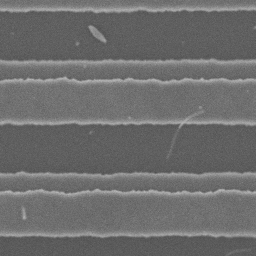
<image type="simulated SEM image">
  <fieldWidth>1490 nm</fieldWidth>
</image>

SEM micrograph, lines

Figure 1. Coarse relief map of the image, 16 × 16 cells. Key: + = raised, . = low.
++++++++++++++++
................
................
................
++++++++++++++++
++++++++++++++++
++++++++++++++++
++++++++++++++++
................
................
................
++++++++++++++++
++++++++++++++++
++++++++++++++++
++++++++++++++++
................